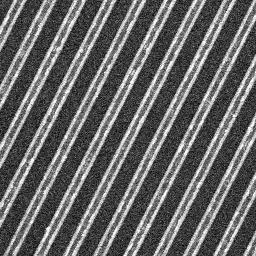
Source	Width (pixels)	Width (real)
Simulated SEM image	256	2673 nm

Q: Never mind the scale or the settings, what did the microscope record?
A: parallel lines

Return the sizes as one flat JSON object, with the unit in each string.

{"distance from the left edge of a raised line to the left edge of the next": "278 nanometers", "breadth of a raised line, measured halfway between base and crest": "0.0942 um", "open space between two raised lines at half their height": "188 nanometres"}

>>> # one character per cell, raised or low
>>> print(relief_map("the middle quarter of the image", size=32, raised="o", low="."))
..oo.....ooo.....oo.....ooo.....
.ooo.....oo......oo.....oo.....o
.oo.....ooo.....oo.....ooo.....o
ooo.....oo.....ooo.....oo.....oo
oo.....ooo.....oo.....ooo.....oo
oo.....oo.....ooo.....oo.....ooo
o.....ooo.....oo.....ooo.....oo.
o.....oo.....ooo.....oo.....ooo.
.....ooo.....oo.....ooo.....oo..
.....oo.....ooo.....oo.....oo...
....ooo.....oo.....ooo.....oo...
....oo.....ooo.....oo.....oo....
...ooo.....oo.....ooo.....oo....
...oo.....ooo.....oo.....oo.....
..ooo.....oo.....ooo.....oo.....
..oo.....ooo.....oo.....oo......
.ooo.....oo.....ooo.....oo.....o
.oo.....oo......oo.....ooo.....o
ooo.....oo.....ooo.....oo.....oo
oo.....oo......oo.....oo......oo
oo.....oo.....ooo.....oo.....oo.
o.....oo......oo.....oo......oo.
o.....oo.....ooo.....oo.....oo..
.....ooo.....oo.....oo......oo..
.....oo.....ooo.....oo.....oo...
....oo......oo.....oo......oo...
....oo.....oo......oo.....oo....
...ooo.....oo.....oo.....ooo....
...oo.....oo......oo.....oo.....
..oo......oo.....oo.....ooo.....
..oo.....oo......oo.....oo......
.oo......oo.....oo.....ooo.....o